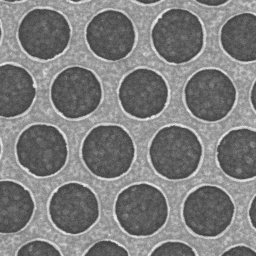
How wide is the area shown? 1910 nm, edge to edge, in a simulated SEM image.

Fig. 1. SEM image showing a regular array of holes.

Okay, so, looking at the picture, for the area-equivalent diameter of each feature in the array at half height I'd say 388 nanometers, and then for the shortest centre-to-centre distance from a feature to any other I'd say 0.496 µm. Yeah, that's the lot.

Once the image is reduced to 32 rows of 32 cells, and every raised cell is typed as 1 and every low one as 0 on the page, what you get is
11111111111111111101111110001111
11110001111110011111100011111111
11100000111000001111000001111000
11000000011000000110000001110000
11000000011000000110000000100000
11100000011000000110000001110000
11100000111100001111000001110000
11111011111111011111100011111000
00011111101111111111111111111111
00001110000011110000111100001111
00001110000001100000011000000111
00001100000001100000011000000010
00001100000001100000011000000110
00001110000011100000111100000111
00111111000111110001111100001111
11111111111111111111111111111111
11100001111000001111000011111000
11000000110000000110000001110000
11000000110000000110000001100000
11000000110000000110000001100000
11100000111000001110000001100000
11110001111000001111000011110000
11111111111111111111111111111111
00011110000111110000111110011111
00001110000011100000011000000111
00001100000011000000011000000110
00001100000011000000011000000110
00001100000011100000011000000110
00011110000111100000111100001111
11111111111111111111111110011111
11100011111100011111000111111111
11000001111000001110000011110000